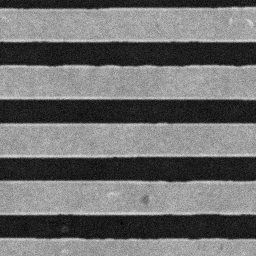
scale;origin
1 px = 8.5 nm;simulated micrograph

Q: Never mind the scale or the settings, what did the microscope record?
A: lines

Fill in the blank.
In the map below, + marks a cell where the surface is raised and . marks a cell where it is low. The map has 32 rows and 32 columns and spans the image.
................................
++++++++++++++++++++++++++++++++
++++++++++++++++++++++++++++++++
++++++++++++++++++++++++++++++++
++++++++++++++++++++++++++++++++
................................
................................
................................
++++++++++++++++++++++++++++++++
++++++++++++++++++++++++++++++++
++++++++++++++++++++++++++++++++
++++++++++++++++++++++++++++++++
................................
................................
................................
....................+...........
++++++++++++++++++++++++++++++++
++++++++++++++++++++++++++++++++
++++++++++++++++++++++++++++++++
++++++++++++++++++++++..........
................................
................................
................................
++++++++++++++++++++++++++++++++
++++++++++++++++++++++++++++++++
++++++++++++++++++++++++++++++++
++++++++++++++++++++++++++++++++
................................
................................
................................
++++++++++++++++++++++++++++++++
++++++++++++++++++++++++++++++++